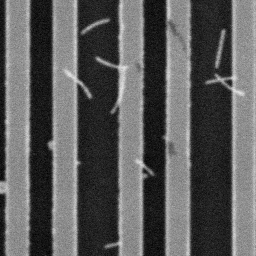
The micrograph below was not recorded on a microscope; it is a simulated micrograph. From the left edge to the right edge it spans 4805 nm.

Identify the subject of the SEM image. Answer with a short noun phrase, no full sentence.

lines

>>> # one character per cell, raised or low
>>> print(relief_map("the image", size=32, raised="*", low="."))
.***...***.....***...***.....***
.***...***.....***...***.....***
.***...***.....***...***.....***
.***...***.....***...***.....***
.***...***.....***...***.....***
.***...***.....***...***.....***
.***...***.....***...***.....***
.***...***.....***...***.....***
.***...***.....***...***.....***
.***...***.....***...***.....***
.***...***.....***...***.....***
.***...***.....***...***.....***
.***...***.....***...***.....***
.***...***.....***...***.....***
.***...***.....***...***.....***
.***...***.....***...***.....***
.***...***.....***...***.....***
.***...***.....***...***.....***
.***...***.....***...***.....***
.***...***.....***...***.....***
.***...***.....***...***.....***
.***...***.....***...***.....***
.***...***.....***...***.....***
****...***.....***...***.....***
.***...***.....***...***.....***
.***...***.....***...***.....***
.***...**......***...***.....***
.***...***.....***...***.....***
.***...***.....***...***.....***
.***...***.....***...***.....***
.***...***.....***...***.....***
.***...***.....***...***.....***